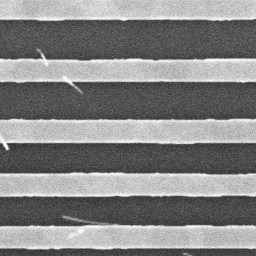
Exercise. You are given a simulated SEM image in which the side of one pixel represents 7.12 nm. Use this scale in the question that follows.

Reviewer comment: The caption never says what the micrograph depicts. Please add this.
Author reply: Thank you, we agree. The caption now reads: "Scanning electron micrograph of lines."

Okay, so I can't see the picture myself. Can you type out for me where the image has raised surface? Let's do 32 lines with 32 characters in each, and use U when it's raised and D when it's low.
UUUUUUUUUUUUUUUUUUUUUUUUUUUUUUUU
UUUUUUUUUUUUUUUUUUUUUUUUUUUUUUUU
DDDDDDDDDDDDDDDDDDDDDDDDDDDDDDDD
DDDDDDDDDDDDDDDDDDDDDDDDDDDDDDDD
DDDDDDDDDDDDDDDDDDDDDDDDDDDDDDDD
DDDDDDDDDDDDDDDDDDDDDDDDDDDDDDDD
DDDDDDDDDDDDDDDDDDDDDDDDDDDDDDDD
UUUUUUDDDDDDDDUUUUDDDDDDUUUUUUUU
UUUUUUUUUUUUUUUUUUUUUUUUUUUUUUUU
UUUUUUUUUUUUUUUUUUUUUUUUUUUUUUUU
DDDDDDDDDDDDDDDDDDDDDDDDDDDDDDDD
DDDDDDDDDDDDDDDDDDDDDDDDDDDDDDDD
DDDDDDDDDDDDDDDDDDDDDDDDDDDDDDDD
DDDDDDDDDDDDDDDDDDDDDDDDDDDDDDDD
DDDDDDDDDDDDDDDDDDDDDDDDDDDDDDDD
UUUUUUUUUUUUUUUUUUUUUUUUUUUUUUUU
UUUUUUUUUUUUUUUUUUUUUUUUUUUUUUUU
UUUUUUUUUUUUUUUUUUUUUUUUUUUUUUUU
DDDDDDDDDDDDDDDDDDDDDDDDDDDDDDDD
DDDDDDDDDDDDDDDDDDDDDDDDDDDDDDDD
DDDDDDDDDDDDDDDDDDDDDDDDDDDDDDDD
DDDDDDDDDDDDDDDDDDDDDDDDDDDDDDDD
UUUUUUUUUUUUUUUUUUUUUUUUUUUUUUUU
UUUUUUUUUUUUUUUUUUUUUUUUUUUUUUUU
DDDDDDDDDDDDDDDDDDDDDDDDDDDDDDDD
DDDDDDDDDDDDDDDDDDDDDDDDDDDDDDDD
DDDDDDDDDDDDDDDDDDDDDDDDDDDDDDDD
DDDDDDDDDDDDDDDDDDDDDDDDDDDDDDDD
UUUUUUUUUUUUUUUUUUUUUUUUUUUUUUUU
UUUUUUUUUUUUUUUUUUUUUUUUUUUUUUUU
UUUUUUUUUUUUUUUUUUUUUUUUUUUUUUUU
DDDDDDDDDDDDDDDDDDDDDDDDDDDDDDDD